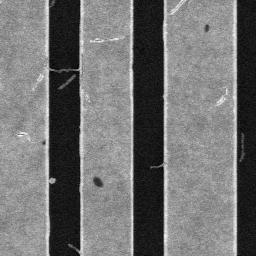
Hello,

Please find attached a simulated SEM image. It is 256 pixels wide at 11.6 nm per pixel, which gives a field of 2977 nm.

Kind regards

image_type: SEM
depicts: lines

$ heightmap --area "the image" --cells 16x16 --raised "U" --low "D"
UUUDDUUUDDUUUUUD
UUUDDUUUDDUUUUUD
UUUDDUUUDDUUUUUD
UUUDDUUUDDUUUUUD
UUUDDUUUDDUUUUUD
UUUDDUUUDDUUUUUD
UUUDDUUUDDUUUUUD
UUUDDUUUDDUUUUUD
UUUDDUUUDDUUUUUD
UUUDDUUUDDUUUUUD
UUUDDUUUDDUUUUUD
UUUDDUUUDDUUUUUD
UUUDDUUUDDUUUUUD
UUUDDUUUDDUUUUUD
UUUDDUUUDDUUUUUD
UUUDDUUUDDUUUUUD